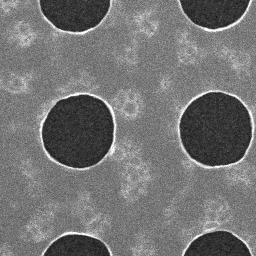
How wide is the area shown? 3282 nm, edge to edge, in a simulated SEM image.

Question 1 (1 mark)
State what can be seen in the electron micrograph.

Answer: holes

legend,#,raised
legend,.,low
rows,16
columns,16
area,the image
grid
###....####....#
###...######..##
################
################
################
################
####...#####...#
###....####.....
###....####.....
###....#####...#
################
################
################
################
#############.##
###....#####...#